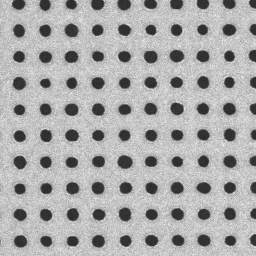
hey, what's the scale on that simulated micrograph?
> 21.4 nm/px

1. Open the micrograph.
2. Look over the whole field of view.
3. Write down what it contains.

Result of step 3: a regular array of holes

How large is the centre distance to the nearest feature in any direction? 556 nanometers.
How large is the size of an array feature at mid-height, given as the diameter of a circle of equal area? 0.264 um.